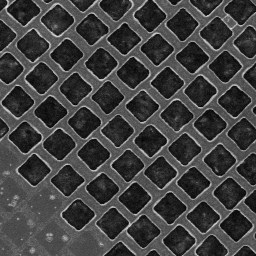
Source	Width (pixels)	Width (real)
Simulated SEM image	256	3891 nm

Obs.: a regular array of holes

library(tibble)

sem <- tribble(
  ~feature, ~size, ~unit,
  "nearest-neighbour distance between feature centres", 512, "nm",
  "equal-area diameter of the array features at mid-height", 434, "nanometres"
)